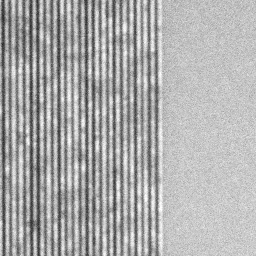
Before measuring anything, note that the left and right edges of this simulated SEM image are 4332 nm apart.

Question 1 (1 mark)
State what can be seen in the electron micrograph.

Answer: parallel lines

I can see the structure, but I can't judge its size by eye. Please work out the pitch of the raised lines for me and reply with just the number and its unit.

0.117 micrometres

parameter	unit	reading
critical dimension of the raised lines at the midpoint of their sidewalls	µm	0.0487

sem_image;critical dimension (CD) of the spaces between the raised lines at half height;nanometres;65.6